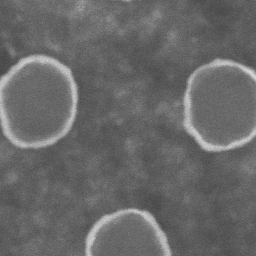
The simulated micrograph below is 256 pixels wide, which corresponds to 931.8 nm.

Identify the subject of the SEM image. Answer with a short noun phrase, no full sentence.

raised bodies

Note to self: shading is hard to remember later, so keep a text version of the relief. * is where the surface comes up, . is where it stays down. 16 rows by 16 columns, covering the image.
................
................
................
................
.***........****
*****.......****
*****.......****
*****.......****
.***........****
................
................
................
................
.......**.......
......****......
.....*****......